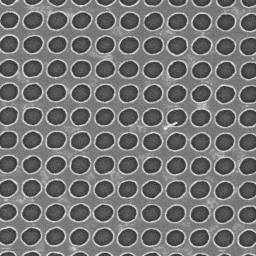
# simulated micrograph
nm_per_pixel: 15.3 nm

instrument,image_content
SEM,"a regular array of holes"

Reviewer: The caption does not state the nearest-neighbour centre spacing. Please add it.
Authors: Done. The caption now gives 365 nm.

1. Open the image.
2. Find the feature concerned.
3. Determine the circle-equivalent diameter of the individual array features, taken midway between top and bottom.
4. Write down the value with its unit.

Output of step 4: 284 nm